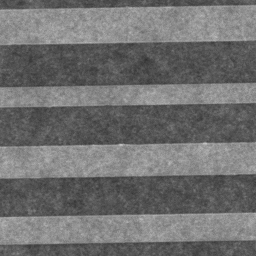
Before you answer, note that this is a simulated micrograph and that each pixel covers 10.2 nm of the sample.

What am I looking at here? one or a few lines or trenches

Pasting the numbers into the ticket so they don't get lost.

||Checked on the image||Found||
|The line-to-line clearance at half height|40.4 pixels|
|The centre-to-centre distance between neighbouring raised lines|694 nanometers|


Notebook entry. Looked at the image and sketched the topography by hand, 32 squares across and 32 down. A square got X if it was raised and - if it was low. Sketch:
--------------------------------
XXXXXXXXXXXXXXXXXXXXXXXXXXXXXXXX
XXXXXXXXXXXXXXXXXXXXXXXXXXXXXXXX
XXXXXXXXXXXXXXXXXXXXXXXXXXXXXXXX
XXXXXXXXXXXXXXXXXXXXXXXXXXXXXXXX
X-------------------------------
--------------------------------
--------------------------------
--------------------------------
--------------------------------
-----------------------------X-X
XXXXXXXXXXXXXXXXXXXXXXXXXXXXXXXX
XXXXXXXXXXXXXXXXXXXXXXXXXXXXXXXX
--------------------------------
--------------------------------
--------------------------------
--------------------------------
--------------------------------
XXXXXXXXXXXXXXXXXXXXXXXXXXXXXXXX
XXXXXXXXXXXXXXXXXXXXXXXXXXXXXXXX
XXXXXXXXXXXXXXXXXXXXXXXXXXXXXXXX
XXXXXXXXXXXXXXXXXXXXXXXXXXXXXXXX
--------------------------------
--------------------------------
--------------------------------
--------------------------------
--------------------------------
XXXXXXXXXXXXXXXXXXXXXXXXXXXXXXXX
XXXXXXXXXXXXXXXXXXXXXXXXXXXXXXXX
XXXXXXXXXXXXXXXXXXXXXXXXXXXXXXXX
X-------------------------------
--------------------------------